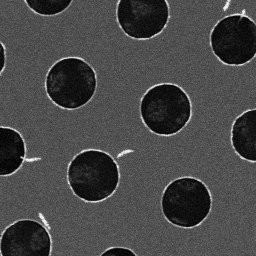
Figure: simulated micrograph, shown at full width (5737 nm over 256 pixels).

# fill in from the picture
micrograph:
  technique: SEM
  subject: holes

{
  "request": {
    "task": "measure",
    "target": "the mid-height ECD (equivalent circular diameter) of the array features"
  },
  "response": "1.12 micrometres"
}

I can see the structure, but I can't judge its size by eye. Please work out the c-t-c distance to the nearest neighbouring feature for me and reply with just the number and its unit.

2130 nm